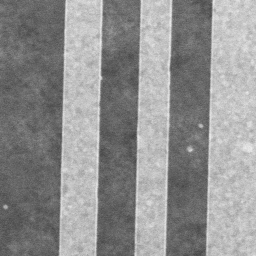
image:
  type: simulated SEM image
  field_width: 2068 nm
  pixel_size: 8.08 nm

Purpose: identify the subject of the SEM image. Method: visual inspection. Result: one or a few lines or trenches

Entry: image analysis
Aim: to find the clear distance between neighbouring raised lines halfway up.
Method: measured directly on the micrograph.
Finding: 332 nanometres